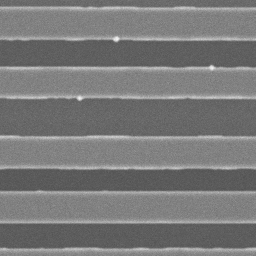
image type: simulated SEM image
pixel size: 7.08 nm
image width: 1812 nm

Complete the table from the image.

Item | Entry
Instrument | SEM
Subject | lines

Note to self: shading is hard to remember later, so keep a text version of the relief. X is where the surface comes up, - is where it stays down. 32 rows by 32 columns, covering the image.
--------------------------------
XXXXXXXXXXXXXXXXXXXXXXXXXXXXXXXX
XXXXXXXXXXXXXXXXXXXXXXXXXXXXXXXX
XXXXXXXXXXXXXXXXXXXXXXXXXXXXXXXX
XXXXXXXXXXXXXXXXXXXXXXXXXXXXXXXX
--------------------------------
--------------------------------
--------------------------------
XXXXXXXXXXXXXXXXXXXXXX-XXXXX-XXX
XXXXXXXXXXXXXXXXXXXXXXXXXXXXXXXX
XXXXXXXXXXXXXXXXXXXXXXXXXXXXXXXX
XXXXXXXXXXXXXXXXXXXXXXXXXXXXXXXX
--------------------------------
--------------------------------
--------------------------------
--------------------------------
--------------------------------
XXXXXXXXXXXXXXXXXXXXXXXXXXXXXXXX
XXXXXXXXXXXXXXXXXXXXXXXXXXXXXXXX
XXXXXXXXXXXXXXXXXXXXXXXXXXXXXXXX
XXXXXXXXXXXXXXXXXXXXXXXXXXXXXXXX
--------------------------------
--------------------------------
--------------------------------
XXXXXXXXXXXXXXXXXXXXXXXXXXXXXXXX
XXXXXXXXXXXXXXXXXXXXXXXXXXXXXXXX
XXXXXXXXXXXXXXXXXXXXXXXXXXXXXXXX
XXXXXXXXXXXXXXXXXXXXXXXXXXXXXXXX
--------------------------------
--------------------------------
--------------------------------
XXXXXXXXXXXXXXXXXXXXXXXXXXXXXXXX